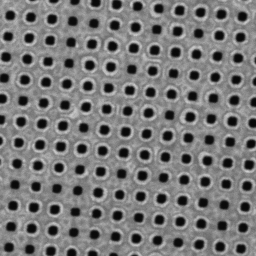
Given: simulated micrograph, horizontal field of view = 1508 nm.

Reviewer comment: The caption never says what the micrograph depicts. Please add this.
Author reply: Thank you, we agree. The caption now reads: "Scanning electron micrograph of a regular array of holes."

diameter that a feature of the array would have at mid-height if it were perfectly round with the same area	60.2	nm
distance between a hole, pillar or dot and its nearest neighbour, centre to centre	123	nanometers